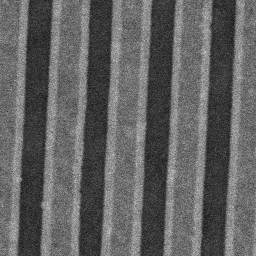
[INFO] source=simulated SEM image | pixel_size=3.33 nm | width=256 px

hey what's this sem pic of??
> one or a few lines or trenches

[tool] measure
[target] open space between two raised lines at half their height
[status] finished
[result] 103 nanometres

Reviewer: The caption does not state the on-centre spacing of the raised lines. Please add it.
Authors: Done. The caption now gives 203 nanometres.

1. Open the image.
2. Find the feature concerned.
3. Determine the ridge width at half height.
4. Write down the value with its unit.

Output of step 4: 100 nm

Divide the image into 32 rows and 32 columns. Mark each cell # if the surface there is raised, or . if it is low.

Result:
###....####....###....####....##
###....####....###....####....##
###....####....###....####....##
###....####...####....####....##
###....####...####....####....##
###....####....###....####....##
###....####...####....####....##
###....###....####....####....##
###....###....####....####....##
###....###....####....####....##
###....###....####....####....##
###...####....####....####....##
###...####....####....###.....##
###...####....####....###.....##
###...####....####....###....###
##....####....####....###....###
##....####....####....###....###
##....####....####....###....###
##....####....####....###....###
##....####....####...####....###
##....####....###....####....###
##....####....###....####....###
##....####....###....####....###
##....####....###....####....###
##....####....###....####....###
##....####...####....####....###
##....####...####....####....###
##....####...####....####....###
##....###....####....####....###
##....###....####....####....###
##....###....####....####....###
##....###....####....####....###